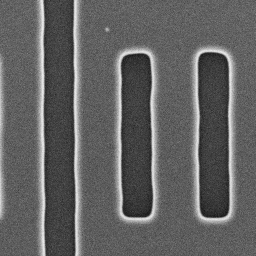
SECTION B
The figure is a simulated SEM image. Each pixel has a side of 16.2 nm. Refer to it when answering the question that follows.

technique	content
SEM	groups of lines, slits or small figures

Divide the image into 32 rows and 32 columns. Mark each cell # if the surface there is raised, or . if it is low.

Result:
#####....#######################
#####....#######################
#####....#######################
#####....#######################
#####....#######################
#####....#######################
#####....########.#######...####
#####....######....######....###
#####....######....######....###
#####....######....######....###
#####....######....######....###
#####....######....######....###
#####....######....######....###
#####....######....######....###
#####....######....######....###
#####....######....######....###
#####....######....######....###
#####.....#####....######....###
#####.....#####....######....###
#####....######....######....###
#####....######....######....###
#####....######....######....###
#####.....#####....######....###
#####.....#####....######....###
#####.....#####....######....###
#####.....#####....######....###
#####.....#####....######....###
#####.....######################
#####.....######################
#####.....######################
#####.....######################
#####.....######################